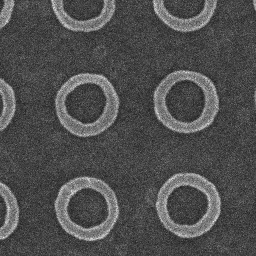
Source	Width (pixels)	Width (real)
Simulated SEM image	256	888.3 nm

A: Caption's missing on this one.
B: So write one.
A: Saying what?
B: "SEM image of ring-shaped raised bodies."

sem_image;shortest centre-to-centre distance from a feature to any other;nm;350